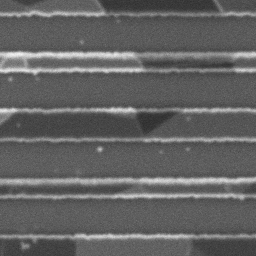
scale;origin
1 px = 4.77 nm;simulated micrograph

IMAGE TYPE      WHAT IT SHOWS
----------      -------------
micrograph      lines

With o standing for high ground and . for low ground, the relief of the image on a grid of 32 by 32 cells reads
oooooooooooooooooooooooooooooooo
oooooooooooooooooooooooooooooooo
................................
................................
................................
................................
................................
oooooooooooooooooooooooooooooooo
oooooooooooooooooooooooooooooooo
................................
................................
................................
................................
................................
oooooooooooooooooooooooooooooooo
oooooooooooooooooooooooooooooooo
oooooooooooooooooooooooooooooooo
oooooooooooooooooooooooooooooooo
................................
................................
................................
................................
................o........oooo.oo
oooooooooooooooooooooooooooooooo
oooooooooooooooooooooooooooooooo
................................
................................
................................
................................
oooooooooooooooooooooooooooooooo
oooooooooooooooooooooooooooooooo
oooooooooooooooooooooooooooooooo